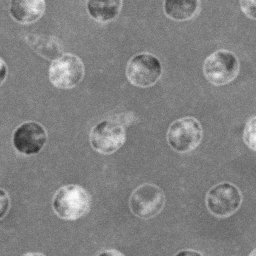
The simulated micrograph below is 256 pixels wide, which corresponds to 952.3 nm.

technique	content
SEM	a regular array of holes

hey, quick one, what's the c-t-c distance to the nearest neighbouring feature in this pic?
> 282 nanometres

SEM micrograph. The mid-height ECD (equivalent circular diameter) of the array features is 125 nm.